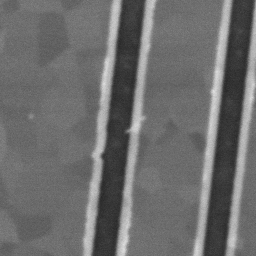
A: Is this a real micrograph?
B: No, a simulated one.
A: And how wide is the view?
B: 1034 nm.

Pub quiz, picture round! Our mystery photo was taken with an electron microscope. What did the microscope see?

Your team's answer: one or a few lines or trenches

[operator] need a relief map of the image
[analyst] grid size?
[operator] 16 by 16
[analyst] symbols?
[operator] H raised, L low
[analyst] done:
HHHHHHHLLHHHHHLL
HHHHHHHLLHHHHHLL
HHHHHHHLLHHHHHLL
HHHHHHHLLHHHHHLL
HHHHHHHLLHHHHHLL
HHHHHHHLLHHHHHLL
HHHHHHHLLHHHHLLH
HHHHHHLLHHHHHLLH
HHHHHHLLHHHHHLLH
HHHHHHLLHHHHHLLH
HHHHHHLLHHHHHLLH
HHHHHHLLHHHHHLLH
HHHHHHLLHHHHHLLH
HHHHHHLLHHHHHLLH
HHHHHHLLHHHHHLLH
HHHHHLLLHHHHLLHH